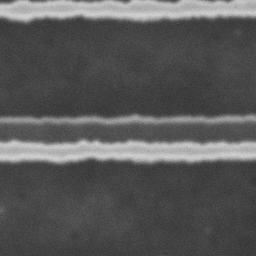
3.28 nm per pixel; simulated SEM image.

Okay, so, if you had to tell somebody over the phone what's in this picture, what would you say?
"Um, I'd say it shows lines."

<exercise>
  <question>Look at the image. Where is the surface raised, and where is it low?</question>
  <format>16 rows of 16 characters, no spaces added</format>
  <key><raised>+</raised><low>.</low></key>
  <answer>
++++++++++++++++
................
................
................
................
................
................
++++++..+.++++++
++++++++++++++++
++++++++++++++++
................
................
................
................
................
................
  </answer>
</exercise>